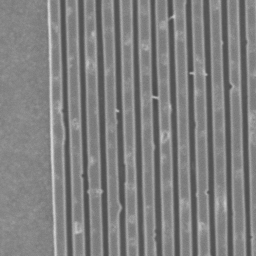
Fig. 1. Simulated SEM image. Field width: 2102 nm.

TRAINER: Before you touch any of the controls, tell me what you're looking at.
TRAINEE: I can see parallel lines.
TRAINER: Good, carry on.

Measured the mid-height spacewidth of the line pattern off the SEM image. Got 49.2 nanometres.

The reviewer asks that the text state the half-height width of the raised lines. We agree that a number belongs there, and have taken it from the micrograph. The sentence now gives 11.7 pixels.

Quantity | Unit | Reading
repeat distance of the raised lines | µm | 0.147